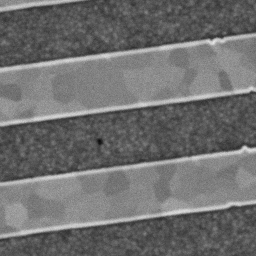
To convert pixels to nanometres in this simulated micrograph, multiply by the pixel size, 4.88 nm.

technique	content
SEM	one or a few lines or trenches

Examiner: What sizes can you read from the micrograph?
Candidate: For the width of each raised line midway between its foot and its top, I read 263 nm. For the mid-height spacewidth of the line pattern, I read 0.285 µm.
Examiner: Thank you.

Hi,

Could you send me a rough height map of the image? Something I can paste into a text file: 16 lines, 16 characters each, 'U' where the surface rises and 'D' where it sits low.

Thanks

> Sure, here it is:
UDDDDDDDDDDDDDDD
DDDDDDDDDDDDDDDD
DDDDDDDDDDDDDDUU
DDDDDDUUUUUUUUUU
UUUUUUUUUUUUUUUU
UUUUUUUUUUUUUUUU
UUUUUUUUUDDDDDDD
UUDDDDDDDDDDDDDD
DDDDDDDDDDDDDDDD
DDDDDDDDDDDDDDDU
DDDDDDDUUUUUUUUU
UUUUUUUUUUUUUUUU
UUUUUUUUUUUUUUUU
UUUUUUUUUUDDDDDD
UUDDDDDDDDDDDDDD
DDDDDDDDDDDDDDDD